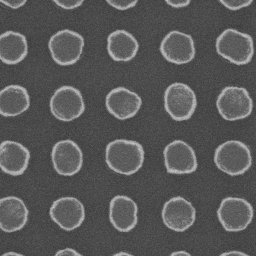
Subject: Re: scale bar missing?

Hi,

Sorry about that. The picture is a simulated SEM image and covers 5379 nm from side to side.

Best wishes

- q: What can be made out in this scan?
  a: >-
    a regular array of raised bodies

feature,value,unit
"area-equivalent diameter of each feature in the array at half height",678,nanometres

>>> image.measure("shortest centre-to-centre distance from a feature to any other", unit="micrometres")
1.13